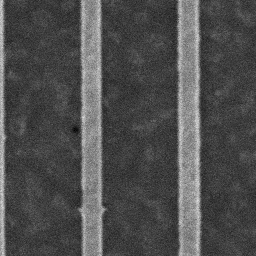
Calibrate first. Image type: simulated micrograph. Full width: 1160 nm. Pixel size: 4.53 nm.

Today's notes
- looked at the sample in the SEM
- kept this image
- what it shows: one or a few lines or trenches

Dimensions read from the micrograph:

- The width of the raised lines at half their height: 0.077 µm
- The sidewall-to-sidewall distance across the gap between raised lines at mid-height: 364 nanometers